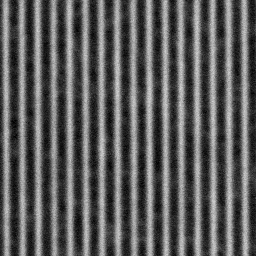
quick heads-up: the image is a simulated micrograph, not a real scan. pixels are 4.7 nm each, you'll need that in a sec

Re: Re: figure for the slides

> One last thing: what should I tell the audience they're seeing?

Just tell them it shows parallel lines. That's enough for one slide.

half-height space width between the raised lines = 0.0546 microns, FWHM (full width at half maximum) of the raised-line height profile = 18.2 nm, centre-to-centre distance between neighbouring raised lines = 74.8 nm